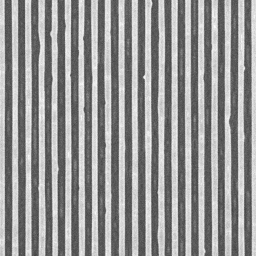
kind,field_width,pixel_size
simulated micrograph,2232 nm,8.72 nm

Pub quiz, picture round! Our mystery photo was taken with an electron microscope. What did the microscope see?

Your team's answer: parallel lines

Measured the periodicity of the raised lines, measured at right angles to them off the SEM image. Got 13.3 pixels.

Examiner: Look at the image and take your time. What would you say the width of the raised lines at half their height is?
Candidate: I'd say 51.2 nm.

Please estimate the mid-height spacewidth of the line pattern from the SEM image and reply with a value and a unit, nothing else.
0.0676 µm